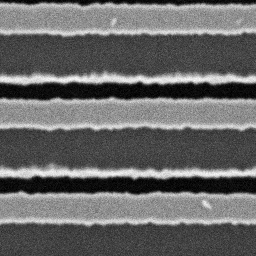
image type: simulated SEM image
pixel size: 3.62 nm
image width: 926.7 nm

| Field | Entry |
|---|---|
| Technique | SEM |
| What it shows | lines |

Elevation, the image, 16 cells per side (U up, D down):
UUUUUUUUUUUUUUUU
UUUUUUUUUUUUUUUU
DDDDDDDDDDDDDDDD
DDDDDDDDDDDDDDDD
DDDDDDDDDDDDDDDD
DDDDDDDDDDDDDDDD
UUUUUUUUUUUUUUUU
UUUUUUUUUUUUUUUU
DDDDDDDDDDDDDDDD
DDDDDDDDDDDDDDDD
DDDDDDDDDDDDDDDD
DDDDDDDDDDDDDDDD
UUUUUUUUUUUUUUUU
UUUUUUUUUUUUUUUU
DDDDDDDDDDDDDDDD
DDDDDDDDDDDDDDDD